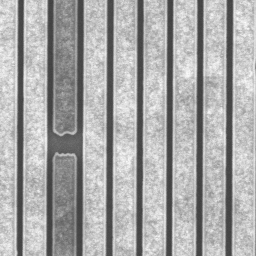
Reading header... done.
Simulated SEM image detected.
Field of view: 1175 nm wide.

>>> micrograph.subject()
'parallel lines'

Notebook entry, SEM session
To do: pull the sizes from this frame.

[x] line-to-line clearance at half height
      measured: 7.36 px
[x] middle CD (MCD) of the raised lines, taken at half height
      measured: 105 nanometres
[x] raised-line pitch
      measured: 137 nanometres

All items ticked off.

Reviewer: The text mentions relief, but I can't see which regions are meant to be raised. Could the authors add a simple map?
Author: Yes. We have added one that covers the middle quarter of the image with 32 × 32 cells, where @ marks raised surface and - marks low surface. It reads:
@@@--@@@@@@--@@@@@--@@@@@---@@@@
@@@--@@@@@@--@@@@@--@@@@@---@@@@
@@@--@@@@@@--@@@@@--@@@@@---@@@@
@@@--@@@@@---@@@@@--@@@@@---@@@@
@@@--@@@@@---@@@@@--@@@@@---@@@@
@@@--@@@@@---@@@@@--@@@@@---@@@@
@@@--@@@@@@--@@@@@--@@@@@---@@@@
@@@--@@@@@@--@@@@@--@@@@@--@@@@@
@@@--@@@@@@--@@@@@--@@@@@--@@@@@
@@@--@@@@@---@@@@@--@@@@@--@@@@@
@@@--@@@@@---@@@@@--@@@@@--@@@@@
@@@--@@@@@---@@@@@--@@@@@--@@@@@
@@@--@@@@@---@@@@@--@@@@@--@@@@@
@@@--@@@@@---@@@@@--@@@@@--@@@@@
@@@--@@@@@---@@@@@--@@@@@--@@@@@
@@@--@@@@@---@@@@@--@@@@@--@@@@@
@@@--@@@@@---@@@@@--@@@@@--@@@@@
-----@@@@@---@@@@@--@@@@@--@@@@@
-----@@@@@---@@@@@--@@@@@--@@@@@
-----@@@@@---@@@@@--@@@@@--@@@@@
-----@@@@@---@@@@@--@@@@@--@@@@@
-----@@@@@---@@@@@--@@@@@--@@@@@
-----@@@@@---@@@@@--@@@@@--@@@@@
@@@--@@@@@---@@@@@--@@@@@--@@@@@
@@@--@@@@@---@@@@@--@@@@@--@@@@@
@@@--@@@@@--@@@@@@--@@@@@--@@@@@
@@@--@@@@@--@@@@@@--@@@@@--@@@@@
@@@--@@@@@--@@@@@@--@@@@@--@@@@@
@@@--@@@@@--@@@@@@--@@@@@--@@@@@
@@@--@@@@@--@@@@@@--@@@@@--@@@@@
@@@--@@@@@--@@@@@@--@@@@@--@@@@@
@@@--@@@@@--@@@@@@--@@@@@--@@@@@